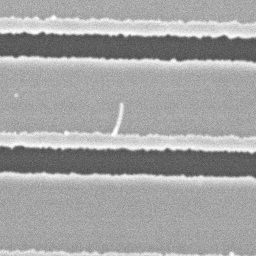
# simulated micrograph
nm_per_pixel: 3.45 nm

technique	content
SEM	lines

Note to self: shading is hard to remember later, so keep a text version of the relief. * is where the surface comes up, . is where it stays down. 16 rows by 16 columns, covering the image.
****************
****************
................
................
****************
****************
****************
****************
****************
................
................
****************
****************
****************
****************
****************